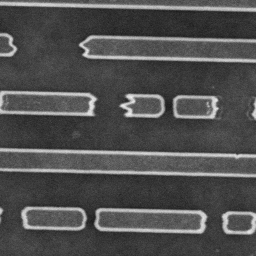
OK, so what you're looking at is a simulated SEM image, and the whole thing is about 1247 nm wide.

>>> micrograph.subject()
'parallel lines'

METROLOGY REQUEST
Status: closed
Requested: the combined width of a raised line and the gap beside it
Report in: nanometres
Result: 280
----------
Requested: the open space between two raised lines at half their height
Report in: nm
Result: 179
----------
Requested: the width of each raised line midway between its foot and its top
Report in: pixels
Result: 20.8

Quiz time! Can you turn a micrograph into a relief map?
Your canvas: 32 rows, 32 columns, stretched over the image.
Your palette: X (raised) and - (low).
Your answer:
--XXXXXXXXXXXXXXXXXXXXXXXXXXXXXX
--------------------------------
--------------------------------
--------------------------------
X-------------------------------
XX--------XXXXXXXXXXXXXXXXXXXXXX
XX---------XXXXXXXXXXXXXXXXXXXXX
-----------------------------XXX
--------------------------------
--------------------------------
--------------------------------
--------------------------------
XXXXXXXXXXXX----XXXX--XXXXX-----
XXXXXXXXXXX-----XXXX--XXXXX-----
----------------------XXXX------
--------------------------------
--------------------------------
--------------------------------
--------------------------------
XXXXXXXXXXXXXXXXXXXXXXXXXXXXXXXX
XXXXXXXXXXXXXXXXXXXXXXXXXXXXXXXX
--------------XXXXXXXXXXXXXXXXXX
--------------------------------
--------------------------------
--------------------------------
--------------------------------
---XXXXXXX--XXXXXXXXXXXXX-------
---XXXXXXXX-XXXXXXXXXXXXX---XXXX
-------XXX--XXXXXXXXXXXXX---XXXX
--------------------------------
--------------------------------
--------------------------------